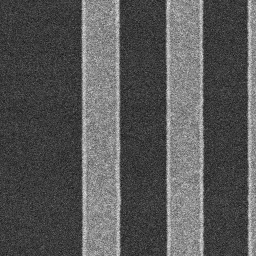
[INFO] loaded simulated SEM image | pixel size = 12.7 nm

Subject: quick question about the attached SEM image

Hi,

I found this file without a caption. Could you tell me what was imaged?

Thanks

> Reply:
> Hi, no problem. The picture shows one or a few lines or trenches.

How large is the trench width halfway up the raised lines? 0.625 µm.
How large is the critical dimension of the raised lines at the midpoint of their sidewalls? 435 nanometres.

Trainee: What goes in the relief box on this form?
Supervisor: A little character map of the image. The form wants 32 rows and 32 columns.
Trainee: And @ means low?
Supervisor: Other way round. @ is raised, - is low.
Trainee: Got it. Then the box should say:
-----------@@@@------@@@@------@
-----------@@@@------@@@@------@
-----------@@@@------@@@@------@
-----------@@@@------@@@@------@
-----------@@@@------@@@@------@
-----------@@@@------@@@@------@
-----------@@@@------@@@@------@
-----------@@@@------@@@@------@
-----------@@@@------@@@@------@
-----------@@@@------@@@@------@
-----------@@@@------@@@@------@
-----------@@@@------@@@@------@
-----------@@@@------@@@@------@
-----------@@@@------@@@@------@
-----------@@@@------@@@@------@
-----------@@@@------@@@@------@
-----------@@@@------@@@@------@
-----------@@@@------@@@@------@
-----------@@@@------@@@@------@
-----------@@@@------@@@@------@
-----------@@@@------@@@@------@
-----------@@@@------@@@@------@
-----------@@@@------@@@@------@
-----------@@@@------@@@@------@
-----------@@@@------@@@@------@
-----------@@@@------@@@@------@
-----------@@@@------@@@@------@
-----------@@@@------@@@@------@
-----------@@@@------@@@@------@
-----------@@@@------@@@@------@
-----------@@@@------@@@@------@
-----------@@@@------@@@@------@